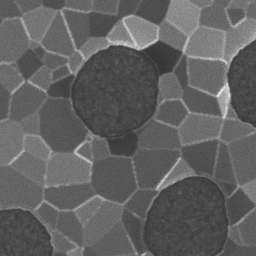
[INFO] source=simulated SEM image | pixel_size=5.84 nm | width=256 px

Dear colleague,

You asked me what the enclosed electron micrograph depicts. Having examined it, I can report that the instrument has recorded holes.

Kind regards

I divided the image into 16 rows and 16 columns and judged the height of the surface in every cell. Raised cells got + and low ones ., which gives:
++++++++++++++++
++++++++++++++++
++++++++++++++++
++++++...++++++.
+++++.....++++..
++++......++++..
+++++.....++++..
+++++....++++++.
++++++..++++++++
++++++++++++++++
++++++++++++++++
+++++++++++...++
++++++++++....++
..+++++++.....++
...++++++.....++
...++++++.....++